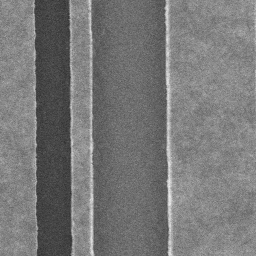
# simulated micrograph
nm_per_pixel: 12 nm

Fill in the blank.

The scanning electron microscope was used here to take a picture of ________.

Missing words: lines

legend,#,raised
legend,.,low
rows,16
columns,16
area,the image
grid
##..##....######
##..##....######
##..##....######
##..##....######
##..##....######
##..##....######
##..##....######
##..##....######
##..##....######
##..##....######
##..##.....#####
##..##....######
##..##.....#####
##..##.....#####
##..##.....#####
##...#.....#####